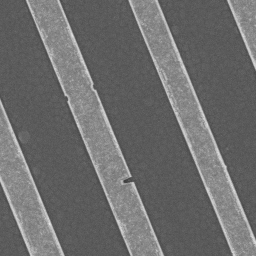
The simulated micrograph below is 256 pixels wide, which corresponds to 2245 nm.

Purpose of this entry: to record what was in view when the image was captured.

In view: one or a few lines or trenches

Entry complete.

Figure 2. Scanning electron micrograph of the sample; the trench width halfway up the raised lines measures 575 nm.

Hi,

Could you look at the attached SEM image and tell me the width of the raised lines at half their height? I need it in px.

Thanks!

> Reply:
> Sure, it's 29.1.